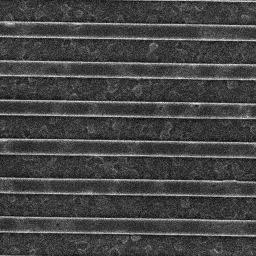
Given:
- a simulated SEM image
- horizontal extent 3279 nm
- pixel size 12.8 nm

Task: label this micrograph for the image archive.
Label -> parallel lines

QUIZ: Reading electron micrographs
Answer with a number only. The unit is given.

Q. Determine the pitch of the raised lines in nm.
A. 499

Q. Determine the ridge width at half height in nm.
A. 195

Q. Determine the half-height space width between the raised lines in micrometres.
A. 0.304